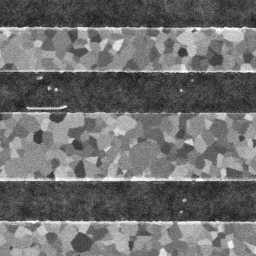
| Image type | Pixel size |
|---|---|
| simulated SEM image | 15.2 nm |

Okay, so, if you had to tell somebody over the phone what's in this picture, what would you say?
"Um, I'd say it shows lines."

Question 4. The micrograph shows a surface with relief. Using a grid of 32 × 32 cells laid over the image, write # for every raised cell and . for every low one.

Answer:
................................
................................
................................
##.#########.#.###..#.....#.#.#.
################################
################################
################################
################################
################################
................................
................................
................................
................................
................................
################################
################################
################################
################################
################################
################################
################################
################################
########.........#..##..########
................................
................................
................................
................................
................................
################################
################################
################################
################################